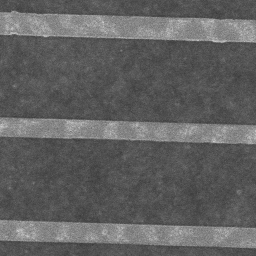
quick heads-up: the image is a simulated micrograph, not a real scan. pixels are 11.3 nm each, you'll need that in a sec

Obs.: one or a few lines or trenches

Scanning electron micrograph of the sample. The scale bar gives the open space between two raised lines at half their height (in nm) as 947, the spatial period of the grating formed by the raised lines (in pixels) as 103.